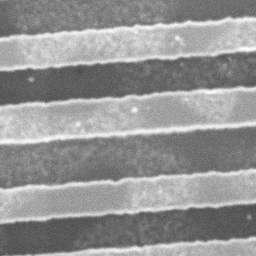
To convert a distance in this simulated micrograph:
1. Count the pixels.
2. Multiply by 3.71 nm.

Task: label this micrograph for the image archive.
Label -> lines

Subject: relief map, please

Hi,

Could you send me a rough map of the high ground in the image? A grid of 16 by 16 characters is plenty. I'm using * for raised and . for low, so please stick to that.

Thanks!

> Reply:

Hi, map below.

................
...........*****
****************
************....
................
................
..**************
****************
******..........
................
................
....************
****************
*****...........
................
.........*******